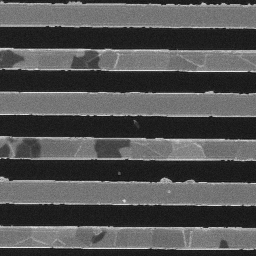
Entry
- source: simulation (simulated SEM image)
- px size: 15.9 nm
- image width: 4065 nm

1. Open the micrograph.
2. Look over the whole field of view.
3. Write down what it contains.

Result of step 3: lines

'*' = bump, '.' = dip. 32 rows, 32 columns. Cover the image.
*******.........................
********************************
********************************
............................****
................................
................................
********************************
********************************
********************************
................................
................................
................................
********************************
********************************
..........................******
................................
................................
*********************...........
********************************
********************************
................................
................................
*...............................
********************************
********************************
......**************************
................................
................................
**************..*...............
********************************
********************************
................................